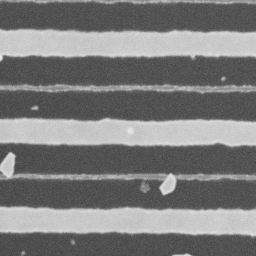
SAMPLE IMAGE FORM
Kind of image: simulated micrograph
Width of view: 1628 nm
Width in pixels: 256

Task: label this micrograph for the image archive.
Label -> lines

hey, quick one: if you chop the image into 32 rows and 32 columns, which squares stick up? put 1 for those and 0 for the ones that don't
00000000000000000000000000000000
00000000000000000000000000000000
00000000000000000000000000000000
00000000000000000000000000000000
11111111111111111111111111111111
11111111111111111111111111111111
11111111111111111111111111111111
00000000000000000000000000000000
00000000000000000000000000000000
00000000000000000000000000000000
00000000000000000000000000000000
00000000000000000000000001000000
00000000000000000000000000000000
00000000000000000000000000000000
00000000000000000000000000000000
11111111111111111111111111111111
11111111111111111111111111111111
11111111111111111111111111111111
00000000000000000000000000000000
01000000000000000000000000000000
11000000000000000000000000000000
11000000000000000000000000000000
00000000000000000000110000000000
00000000000000000000110000000000
00000000000000000000000000000000
00000000000000000000000000000000
11111111111111111111111101111111
11111111111111111111111111111111
11111111111111111111111111111111
00000000000000000000000000000000
00000000000000000000000000000000
00000000000000000000000000000000